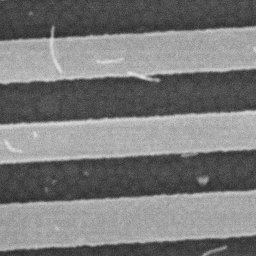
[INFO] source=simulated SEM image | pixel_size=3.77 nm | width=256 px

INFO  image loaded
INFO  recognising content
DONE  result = lines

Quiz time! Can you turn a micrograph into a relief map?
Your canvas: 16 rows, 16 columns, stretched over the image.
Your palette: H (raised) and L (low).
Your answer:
LLLLLLLLLLLLLLLL
LLLLLLLLLLLLLLLL
LHHHHHHHHHHHHHHH
HHHHHHHHHHHHHHHH
HHHHHHHHHHHHHLLL
LLLLLLLLLLLLLLLL
LLLLLLLLLLLLLLLL
LLLLLLHHHHHHHHHH
HHHHHHHHHHHHHHHH
HHHHHHHHHHHHHLLL
LLLLLLLLLLLLLLLL
LLLLLLLLLLLLLLLL
LLLLLHHHHHHHHHHH
HHHHHHHHHHHHHHHH
HHHHHHHHHHHHHHHH
HHLLLLLLLLLLLLLL